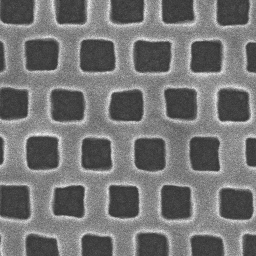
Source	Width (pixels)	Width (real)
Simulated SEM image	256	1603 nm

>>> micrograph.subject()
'a regular array of holes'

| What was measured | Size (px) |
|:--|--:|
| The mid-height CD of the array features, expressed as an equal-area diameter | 34.6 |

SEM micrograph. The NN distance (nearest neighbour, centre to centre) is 337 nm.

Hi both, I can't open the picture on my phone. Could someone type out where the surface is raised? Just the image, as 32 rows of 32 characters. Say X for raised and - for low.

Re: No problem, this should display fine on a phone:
----XXX----XXX----XX----XXX----X
----XXX----XXX----XX----XXX----X
----XXX----XXX----XX----XXX----X
XXXXXXXXXXXXXXXXXXXXXXXXXXXXXXXX
XXXXXXXXXXXXXXXXXXXXXXXXXXXXXXXX
XXX----XXX----XXX----XXX----XXX-
XXX----XXX----XXX----XXX----XXX-
-XX----XXX----XXX----XXX----XXX-
XXX----XXX----XXX----XXX----XXX-
XXXXXXXXXXXXXXXXXXXXXXXXXXXXXXXX
XXXXXXXXXXXXXXXXXXXXXXXXXXXXXXXX
---XXXX---XXXXX---XXX---XXX---XX
----XX----XXXX----XXX----XX----X
---XXX-----XXX----XXX----XX----X
---XXX----XXXX----XXX---XXX----X
XXXXXXXXXXXXXXXXXXXXXXXXXXXXXXXX
XXXXXXXXXXXXXXXXXXXXXXXXXXXXXXXX
XXX----XXXX--XXXX---XXXX---XXXX-
XXX----XXX----XXX----XXX---XXXX-
XXX----XXX----XXX----XXX---XXXX-
XXX----XXX----XXX----XXX---XXXX-
XXXXXXXXXXXXXXXXXXXXXXXXXXXXXXXX
XXXXXXXXXXXXXXXXXXXXXXXXXXXXXXXX
---XXXX---XXXX---XXX---XXXXX-XXX
----XXX----XXX---XXX----XXXX----
----XXX----XXX---XXX----XXX-----
----XXX---XXXX---XXX----XXX-----
XXXXXXXXXXXXXXXXXXXXXXXXXXXXX--X
XXXXXXXXXXXXXXXXXXXXXXXXXXXXXXXX
XXXX-XXXXXX-XXXXX---XXXX--XXXXX-
XXX----XXX----XXX----XXX----XX--
XXX----XXX----XXX----XXX----XX--